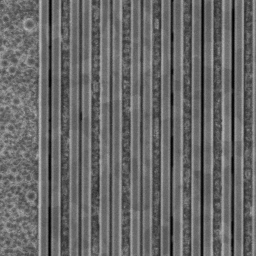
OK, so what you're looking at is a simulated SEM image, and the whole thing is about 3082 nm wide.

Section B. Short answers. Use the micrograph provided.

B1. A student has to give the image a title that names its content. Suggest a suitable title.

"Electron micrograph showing parallel lines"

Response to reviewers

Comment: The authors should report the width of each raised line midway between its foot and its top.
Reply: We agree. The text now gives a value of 94.8 nm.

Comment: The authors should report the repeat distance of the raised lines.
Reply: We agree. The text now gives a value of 181 nanometres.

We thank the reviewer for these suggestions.